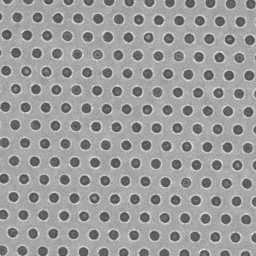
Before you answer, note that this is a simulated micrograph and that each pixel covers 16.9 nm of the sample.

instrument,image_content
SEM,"a regular array of holes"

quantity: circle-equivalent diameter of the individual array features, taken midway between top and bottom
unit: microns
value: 0.177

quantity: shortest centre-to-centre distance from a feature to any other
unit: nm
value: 340